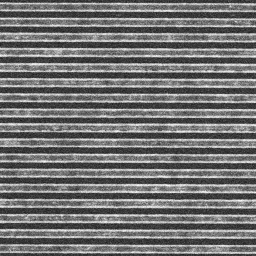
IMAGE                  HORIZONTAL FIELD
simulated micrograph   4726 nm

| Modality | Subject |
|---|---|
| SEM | parallel lines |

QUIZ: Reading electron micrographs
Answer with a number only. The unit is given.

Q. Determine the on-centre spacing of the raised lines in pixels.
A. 15.1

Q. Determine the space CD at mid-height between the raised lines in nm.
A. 150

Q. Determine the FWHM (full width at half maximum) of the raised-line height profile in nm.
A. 118